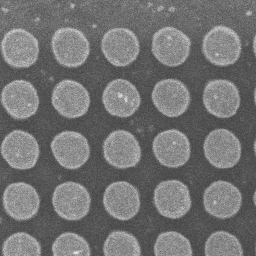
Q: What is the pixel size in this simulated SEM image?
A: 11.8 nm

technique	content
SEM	a regular array of raised bodies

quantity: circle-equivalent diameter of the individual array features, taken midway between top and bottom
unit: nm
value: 441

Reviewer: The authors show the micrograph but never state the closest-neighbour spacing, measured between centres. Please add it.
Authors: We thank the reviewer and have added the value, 0.591 micrometres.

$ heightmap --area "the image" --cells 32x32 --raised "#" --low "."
................................
................................
................................
.....................#..........
.###...###...####..####...####..
#####..####..####..#####..####..
#####..####..####..#####..####..
.###...####...###...###...####..
................................
................................
.###...###....##....###...###...
#####..####..####..####...####..
#####..####..#####.#####.#####..
.####..####..####...###...####..
..##....##.....#.....#.....##...
................................
..#.....#.....##....##.....##...
####...####..####..#####..####..
#####.#####..####..#####.#####..
#####..####..####..#####..####..
.###....##....###...###....##...
................................
................................
.###...###...####...###...###...
.####..####..####..#####..####..
.####..####..####..#####..####..
.####..####...###...###...####..
................................
................................
.###...###....###...###...###...
.####..####..####..#####..####..
#####..####..#####.#####..####..